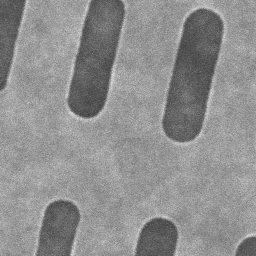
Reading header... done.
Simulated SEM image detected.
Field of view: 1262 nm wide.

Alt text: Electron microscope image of holes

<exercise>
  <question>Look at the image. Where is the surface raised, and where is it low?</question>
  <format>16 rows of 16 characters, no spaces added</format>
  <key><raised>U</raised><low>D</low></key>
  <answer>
DDUUUDDDUUUUUUUU
DUUUUDDDUUUDDDUU
DUUUUDDUUUUDDDUU
DUUUUDDUUUUDDDUU
DUUUUDDUUUUDDUUU
UUUUDDDUUUUDDUUU
UUUUDDDUUUDDDUUU
UUUUUUUUUUDDDUUU
UUUUUUUUUUDDUUUU
UUUUUUUUUUUUUUUU
UUUUUUUUUUUUUUUU
UUUUUUUUUUUUUUUU
UUUUUUUUUUUUUUUU
UUUDDUUUUUUUUUUU
UUDDDUUUUDDUUUUU
UUDDDUUUDDDUUUUD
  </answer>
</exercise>